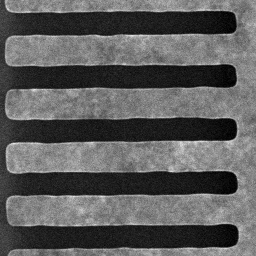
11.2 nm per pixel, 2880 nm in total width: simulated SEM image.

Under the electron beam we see groups of lines, slits or small figures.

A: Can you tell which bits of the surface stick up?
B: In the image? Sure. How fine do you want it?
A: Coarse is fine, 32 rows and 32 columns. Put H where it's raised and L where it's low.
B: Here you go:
LHHHHHHHHHHHHHHHHHHHHHHHHHHHHHHH
LLHHLLLHLLLLLLLLLLLLLLLLLLLLLHHH
LLLLLLLLLLLLLLLLLLLLLLLLLLLLLLHH
LLLLLLLLLLLLLLLLLLLLLLLLLLLLLLHH
LLLLHLLLLLLHHLHHHHHHHHHHHHHHHHHH
LHHHHHHHHHHHHHHHHHHHHHHHHHHHHHHH
LHHHHHHHHHHHHHHHHHHHHHHHHHHHHHHH
LHHHHHHHHHHHHHHHHHHHHHHHHHHHHHHH
LLLLLLLLLLLLLLLLLLLLLLLLLLLLLHHH
LLLLLLLLLLLLLLLLLLLLLLLLLLLLLLHH
LLLLLLLLLLLLLLLLLLLLLLLLLLLLLHHH
LHHHHHHHHHHHHHHHHHHHHHHHHHHHHHHH
LHHHHHHHHHHHHHHHHHHHHHHHHHHHHHHH
LHHHHHHHHHHHHHHHHHHHHHHHHHHHHHHH
LHHHHHHHHHHHHHHHHHHHHHHHHHHHHHHH
LLLLLLLLLLLLLLLLLLLLLLLLLLLLLLHH
LLLLLLLLLLLLLLLLLLLLLLLLLLLLLLHH
LLLLLLLLLLLLLLLLLLLLLLLLLLLLLHHH
LHHHHHHHHHHHHHHHHHHHHHHHHHHHHHHH
LHHHHHHHHHHHHHHHHHHHHHHHHHHHHHHH
LHHHHHHHHHHHHHHHHHHHHHHHHHHHHHHH
LHHHHHLLLLLLLLLLLLLLLLLLLLLLLHHH
LLLLLLLLLLLLLLLLLLLLLLLLLLLLLLHH
LLLLLLLLLLLLLLLLLLLLLLLLLLLLLLHH
LLHHHHHHHHHHHHHHHHHHHHHHHHHHHHHH
LHHHHHHHHHHHHHHHHHHHHHHHHHHHHHHH
LHHHHHHHHHHHHHHHHHHHHHHHHHHHHHHH
LHHHHHHHHHHHHHHHHHHHHHHHHHHHHHHH
LLLLLLLLLLLLLLLLLLLLLLLLLLLLLLHH
LLLLLLLLLLLLLLLLLLLLLLLLLLLLLLHH
LLLLLLLLLLLLLLLLLLLLLLLLLLLLLLHH
LHHHHHHHHHHHHHHHHHHHHHHHHHHHHHHH